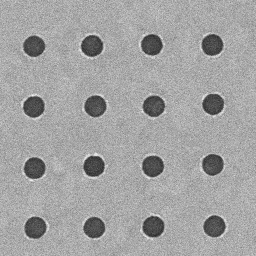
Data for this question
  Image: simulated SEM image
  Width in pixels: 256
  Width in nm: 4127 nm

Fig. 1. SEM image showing a regular array of holes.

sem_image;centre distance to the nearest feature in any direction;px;59.1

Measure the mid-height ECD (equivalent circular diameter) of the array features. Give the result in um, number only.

0.359